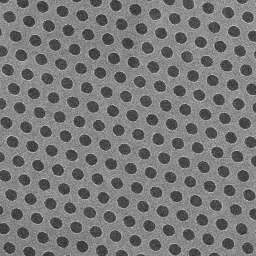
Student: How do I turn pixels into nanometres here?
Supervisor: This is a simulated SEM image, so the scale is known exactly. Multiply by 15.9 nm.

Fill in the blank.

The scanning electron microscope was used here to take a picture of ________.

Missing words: a regular array of holes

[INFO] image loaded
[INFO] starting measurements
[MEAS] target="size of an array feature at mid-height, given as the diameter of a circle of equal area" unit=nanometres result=199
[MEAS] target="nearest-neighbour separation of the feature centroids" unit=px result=19.9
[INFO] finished